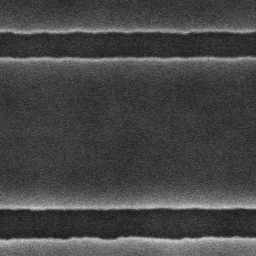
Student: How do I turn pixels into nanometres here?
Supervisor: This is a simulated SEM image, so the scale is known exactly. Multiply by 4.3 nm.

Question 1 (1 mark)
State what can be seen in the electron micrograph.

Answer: lines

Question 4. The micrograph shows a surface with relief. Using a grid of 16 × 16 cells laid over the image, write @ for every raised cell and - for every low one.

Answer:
@@@@@@@@@@@@@@@@
@@@@@@@@@@@@@@@@
----------------
----------------
@@@@@@@@@@@@@@@@
@@@@@@@@@@@@@@@@
@@@@@@@@@@@@@@@@
@@@@@@@@@@@@@@@@
@@@@@@@@@@@@@@@@
@@@@@@@@@@@@@@@@
@@@@@@@@@@@@@@@@
@@@@@@@@@@@@@@@@
@@@@@@@@@@@@@@@@
----------------
----------------
@@@@@@@@@@@@@@@@